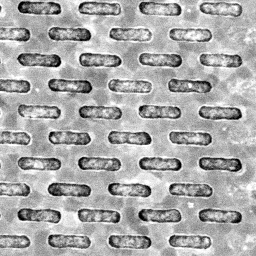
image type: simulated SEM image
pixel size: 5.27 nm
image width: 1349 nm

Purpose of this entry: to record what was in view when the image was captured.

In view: a regular array of holes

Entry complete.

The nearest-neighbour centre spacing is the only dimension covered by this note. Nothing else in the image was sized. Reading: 207 nanometers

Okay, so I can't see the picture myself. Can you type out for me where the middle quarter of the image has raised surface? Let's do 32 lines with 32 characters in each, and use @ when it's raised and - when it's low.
@@@@@---------@@@@@@---------@@@
@@@@@@@@@@@@@@@@@@@@@@@@@@@@@@@@
@@@@@@@@@@@@@@@@@@@@@@@@@@@@@@@@
@@@@@@@@@@@@@@@@@@@@@@@@@@@@@@@@
------@@@@@----------@@@@@------
-------@@@@-----------@@@@------
-------@@@@@----------@@@@------
@@@@@-@@@@@@@@@@@@@@-@@@@@@@@@@@
@@@@@@@@@@@@@@@@@@@@@@@@@@@@@@@@
@@@@@@@@@@@@@@@@@@@@@@@@@@@@@@@@
@@@@@--------@@@@@@---------@@@@
@@@@----------@@@@-----------@@@
@@@@-----------@@@@----------@@@
@@@@@---------@@@@@@---------@@@
@@@@@@@@@@@@@@@@@@@@@@@@@@@@@@@@
@@@@@@@@@@@@@@@@@@@@@@@@@@@@@@@@
@@@@@@@@@@@@@@@@@@@@@@@@@@@@@@@@
------@@@@@----------@@@@@------
-------@@@@-----------@@@@------
-------@@@@-----------@@@@@-----
@@@@@@@@@@@@@@@@@---@@@@@@@@@@@@
@@@@@@@@@@@@@@@@@@@@@@@@@@@@@@@@
@@@@@@@@@@@@@@@@@@@@@@@@@@@@@@@@
@@@@---------@@@@@@---------@@@@
@@@-----------@@@@@----------@@@
@@@-----------@@@@@-----------@@
@@@@@---------@@@@@@---------@@@
@@@@@@@@@@@@@@@@@@@@@@@@@@@@@@@@
@@@@@@@@@@@@@@@@@@@@@@@@@@@@@@@@
--@@@@@@@@@@@@@@@@@@@@@@@@@@@@@@
------@@@@@----------@@@@@------
-------@@@@-----------@@@@------